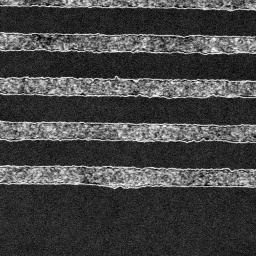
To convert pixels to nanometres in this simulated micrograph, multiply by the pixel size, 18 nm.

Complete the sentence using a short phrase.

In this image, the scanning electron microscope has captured parallel lines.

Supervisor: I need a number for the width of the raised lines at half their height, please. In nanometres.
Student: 503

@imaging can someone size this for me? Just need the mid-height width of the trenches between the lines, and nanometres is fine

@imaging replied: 282